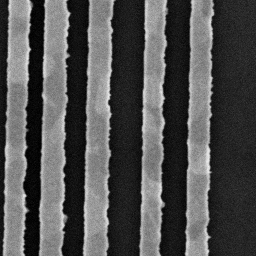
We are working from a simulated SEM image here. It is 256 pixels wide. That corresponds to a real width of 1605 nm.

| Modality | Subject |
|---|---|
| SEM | lines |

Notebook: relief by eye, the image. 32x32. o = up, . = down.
.ooo..oo...ooo....ooo...ooo.....
.ooo..ooo..ooo....ooo...ooo.....
.ooo..ooo..ooo....ooo...oo......
.ooo..ooo..ooo....ooo...oo......
.ooo..oo...ooo....ooo...ooo.....
.ooo..oo...ooo....ooo...oo......
.ooo..oo...ooo....ooo...oo......
.ooo.ooo...ooo....ooo...oo......
.oo..ooo...ooo....ooo...oo......
.ooo.ooo...ooo....ooo...oo......
.oo..ooo...ooo....oo....oo......
.oo..ooo...ooo....oo....oo......
.oo..ooo...ooo....oo....oo......
.oo..ooo...ooo....oo....oo......
.oo..ooo...ooo....oo....oo......
.oo..ooo...ooo....ooo...oo......
.oo..ooo...ooo....oo....oo......
.oo..ooo...ooo....oo...ooo......
.oo..ooo...ooo....oo...ooo......
.oo..ooo...ooo....oo....oo......
.oo..ooo...ooo....oo....oo......
.oo..ooo...ooo....oo...ooo......
.oo..ooo...oo.....oo...ooo......
.oo..ooo...oo.....oo...ooo......
.oo..ooo...ooo....oo...ooo......
.oo..ooo...ooo....oo...ooo......
.oo..ooo...oo.....oo...ooo......
.oo..ooo...oo.....oo...ooo......
.oo..ooo...oo.....oo...ooo......
.oo..ooo...oo.....oo...ooo......
ooo..ooo..oooo....oo...ooo......
ooo..ooo..ooo.....oo...ooo......